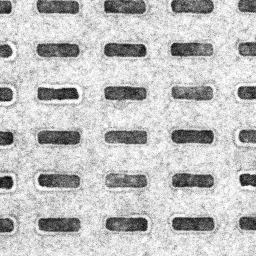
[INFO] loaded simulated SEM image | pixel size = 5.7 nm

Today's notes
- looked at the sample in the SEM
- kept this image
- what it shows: a regular array of holes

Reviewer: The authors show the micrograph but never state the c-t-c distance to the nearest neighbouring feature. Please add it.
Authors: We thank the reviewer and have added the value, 247 nanometers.